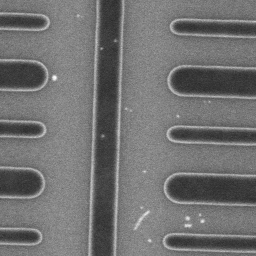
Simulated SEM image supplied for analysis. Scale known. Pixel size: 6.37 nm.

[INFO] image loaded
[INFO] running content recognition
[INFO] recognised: groups of lines, slits or small figures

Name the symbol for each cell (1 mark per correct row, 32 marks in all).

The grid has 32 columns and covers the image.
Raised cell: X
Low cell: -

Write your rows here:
------------XXX-----------------
------------XXX-----------------
XXXXXX------XXX-------XXX-------
XXXXXX------XXX------XXXXXXXXXXX
------------XXX------------XXXXX
------------XXX-----------------
------------XXX-----------------
XXX---------XXX-----------------
XXXXXX------XXX-------XXXXXXXXX-
XXXXXX------XXX------XXXXXXXXXXX
XXXXXX------XXX------XXXXXXXXXXX
------------XXX-------XXXXXXXXXX
------------XXX-----------------
------------XXX-----------------
------------XXX-----------------
XXXXX-------XXX-----------------
XXXXXX------XXX------XXXXXXXXXXX
------------XXX------XXXXXXXXXXX
------------XXX-----------------
------------XXX-----------------
-----------XXXX-----------------
XXXXX------XXXX-----------------
XXXXXX-----XXXX------XXXXXXXXXXX
XXXXXX-----XXXX------XXXXXXXXXXX
XXXX-------XXXX------XXXXXXXXXXX
-----------XXXX-----------XXXXXX
-----------XXXX-----------------
-----------XXXX-----------------
X----------XXX------------------
XXXXX------XXX-------XXXXXXXXXX-
XXXXX------XXX------XXXXXXXXXXXX
-----------XXX------------------